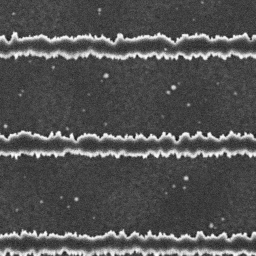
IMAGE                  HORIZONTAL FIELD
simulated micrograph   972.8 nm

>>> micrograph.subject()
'lines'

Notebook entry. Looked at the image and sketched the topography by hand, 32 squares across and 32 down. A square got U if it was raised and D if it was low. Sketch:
DDDDDDDDDDDDDDDDDDDDDDDDDDDDDDDD
DDDDDDDDDDDDDDDDDDDDDDDDDDDDDDDD
DDDDDDDDDDDDDDDDDDDDDDDDDDDDDDDD
DDDDDDDDDDDDDDDDDDDDDDDDDDDDDDDD
DDDDDUDDDDUDDDDDDDUUUDDUUUDDDDUD
UUUUUUUUUUUUUUUUUUUUUUUUUUUUUUUU
UUUUUUUUUUUUUUUUUUUUUUUUUUUUUUUU
DDDDDDDDDDDDDDDDDDDDDDDDDDDDDDDD
DDDDDDDDDDDDDDDDDDDDDDDDDDDDDDDD
DDDDDDDDDDDDDDDDDDDDDDDDDDDDDDDD
DDDDDDDDDDDDDDDDDDDDDDDDDDDDDDDD
DDDDDDDDDDDDDDDDDDDDDDDDDDDDDDDD
DDDDDDDDDDDDDDDDDDDDDDDDDDDDDDDD
DDDDDDDDDDDDDDDDDDDDDDDDDDDDDDDD
DDDDDDDDDDDDDDDDDDDDDDDDDDDDDDDD
DDDDDDDDDDDDDDDDDDDDDDDDDDDDDDDD
DDDDDDDDDDDDDDDDDDDDDDDDDDDDDDDD
UUUUUUUUUUUUUUUUUUUUUUUUUUUUUUUU
UUUUUUUUUUUUUUUUUUUUUUUUUUUUUUUU
DDDDDDDDDDDDDDDDDDDDDDDDDDDDDDDD
DDDDDDDDDDDDDDDDDDDDDDDDDDDDDDDD
DDDDDDDDDDDDDDDDDDDDDDDDDDDDDDDD
DDDDDDDDDDDDDDDDDDDDDDDDDDDDDDDD
DDDDDDDDDDDDDDDDDDDDDDDDDDDDDDDD
DDDDDDDDDDDDDDDDDDDDDDDDDDDDDDDD
DDDDDDDDDDDDDDDDDDDDDDDDDDDDDDDD
DDDDDDDDDDDDDDDDDDDDDDDDDDDDDDDD
DDDDDDDDDDDDDDDDDDDDDDDDDDDDDDDD
DDDDDDDDDDDDDDDDDDDDDDDDDDDDDDDD
UUUUUUUUUUUDDUUUUUUUUDDUUUUUDUUU
UUUUUUUUUUUUUUUUUUUUUUUUUUUUUUUU
UUUUUUUUUUUUUUUUDUUUUUUUUUUUUUUU